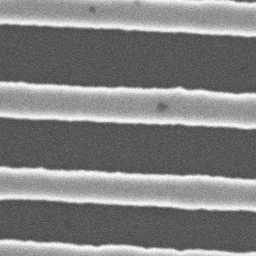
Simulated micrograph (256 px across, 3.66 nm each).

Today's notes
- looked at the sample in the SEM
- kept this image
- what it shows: lines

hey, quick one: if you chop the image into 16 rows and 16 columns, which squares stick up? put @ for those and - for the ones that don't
@@@@@@@@@@@@@@@@
--@@@@@@@@@@@@@@
----------------
----------------
----------------
@@@@@@@---------
@@@@@@@@@@@@@@@@
-----@@@@@@@@@@@
----------------
----------------
----------------
@@@@@@@@@@@@@@@@
---@@@@@@@@@@@@@
----------------
----------------
@@@@@@@@@-------